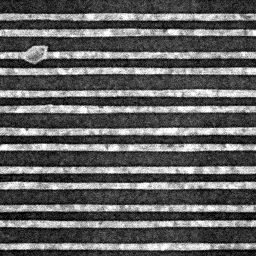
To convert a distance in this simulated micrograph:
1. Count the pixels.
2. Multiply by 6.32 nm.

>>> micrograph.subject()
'parallel lines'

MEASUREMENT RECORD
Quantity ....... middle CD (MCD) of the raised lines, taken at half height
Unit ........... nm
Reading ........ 37.1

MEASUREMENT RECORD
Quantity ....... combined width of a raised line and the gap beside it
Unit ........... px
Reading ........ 19.1